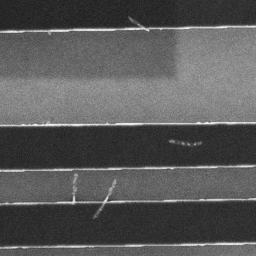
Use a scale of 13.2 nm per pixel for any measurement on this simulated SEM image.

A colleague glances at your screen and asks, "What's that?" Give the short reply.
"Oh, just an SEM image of lines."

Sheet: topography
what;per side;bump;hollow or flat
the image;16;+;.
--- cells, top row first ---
++++++++++++++++
++++++++++++++++
................
................
................
................
................
................
++++++++++++++++
++++++++++++++++
+++++++++++.....
................
............++++
++++++++++++++++
++++++++++++++++
................